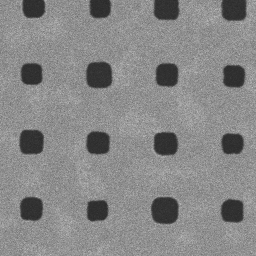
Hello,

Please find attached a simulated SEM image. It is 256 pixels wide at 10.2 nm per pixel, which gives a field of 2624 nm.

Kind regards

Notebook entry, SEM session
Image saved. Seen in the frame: a regular array of holes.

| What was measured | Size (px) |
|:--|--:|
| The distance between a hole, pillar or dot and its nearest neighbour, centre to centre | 66.8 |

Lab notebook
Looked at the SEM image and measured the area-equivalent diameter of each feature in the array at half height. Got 250 nm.